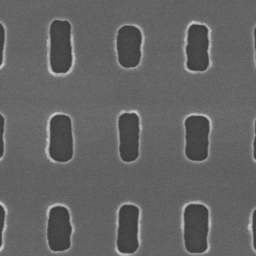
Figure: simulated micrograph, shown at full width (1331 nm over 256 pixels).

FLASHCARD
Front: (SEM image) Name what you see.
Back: a regular array of holes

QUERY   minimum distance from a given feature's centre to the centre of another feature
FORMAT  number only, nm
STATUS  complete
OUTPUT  353